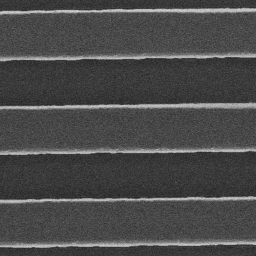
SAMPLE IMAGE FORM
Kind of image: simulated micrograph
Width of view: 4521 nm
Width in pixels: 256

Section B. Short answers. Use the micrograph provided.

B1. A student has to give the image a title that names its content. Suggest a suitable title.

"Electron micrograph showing lines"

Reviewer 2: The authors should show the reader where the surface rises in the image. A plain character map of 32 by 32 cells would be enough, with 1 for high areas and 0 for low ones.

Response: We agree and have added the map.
00000000000000000000000000000000
00011111111111111111111111111111
11111111111111111111111111111111
11111111111111111111111111111111
11111111111111111111111111111111
11111111111111111111111111111111
11111111111111111111111111111111
00000000000000000000000000000000
00000000000000000000000000000000
00000000000000000000000000000000
00000000000000000000000000000000
00000000000000000000000000000000
00000000000000000000000000000000
11111111111111111111111111111111
11111111111111111111111111111111
11111111111111111111111111111111
11111111111111111111111111111111
11111111111111111111111111111111
11111111111111111111111111111111
00000000000000000000000000000000
00000000000000000000000000000000
00000000000000000000000000000000
00000000000000000000000000000000
00000000000000000000000000000000
00000000000000000000000000000000
11111111111111111111111111111111
11111111111111111111111111111111
11111111111111111111111111111111
11111111111111111111111111111111
11111111111111111111111111111111
11111111111111111111100000000000
00000000000000000000000000000000